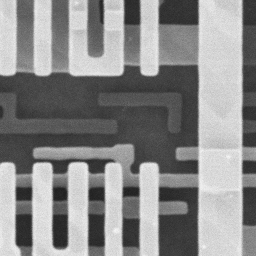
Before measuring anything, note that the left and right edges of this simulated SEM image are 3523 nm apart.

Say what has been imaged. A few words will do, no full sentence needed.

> wiring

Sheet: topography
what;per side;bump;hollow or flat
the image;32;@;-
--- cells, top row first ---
@@--@@---@@--@@---@@-----@@@@@--
@@--@@---@@--@@---@@-----@@@@@--
@@--@@---@@--@@---@@-----@@@@@--
@@--@@---@@--@@---@@-----@@@@@--
@@--@@---@@--@@---@@-----@@@@@--
@@--@@---@@--@@---@@-----@@@@@--
@@--@@---@@--@@---@@-----@@@@@--
@@--@@---@@@@@@---@@-----@@@@@--
@@--@@---@@@@@@---@@-----@@@@@--
-------------------------@@@@@--
-------------------------@@@@@--
-------------------------@@@@@--
-------------------------@@@@@--
-------------------------@@@@@--
-------------------------@@@@@--
-------------------------@@@@@--
-------------------------@@@@@--
-------------------------@@@@@--
-------------------------@@@@@--
-------------------------@@@@@--
@----@---@@---@---@------@@@@@--
@@--@@---@@--@@---@@-----@@@@@--
@@--@@---@@--@@--@@@-----@@@@@--
@@--@@---@@--@@---@@-----@@@@@--
@@--@@---@@--@@---@@-----@@@@@--
@@--@@---@@--@@---@@-----@@@@@--
@@--@@---@@--@@---@@-----@@@@@--
@@--@@---@@--@@---@@-----@@@@@--
@@--@@---@@--@@---@@-----@@@@@--
@@--@@---@@--@@---@@-----@@@@@--
@@--@@@--@@--@@---@@-----@@@@@--
@@--@@@@@@@--@@---@@-----@@@@@--